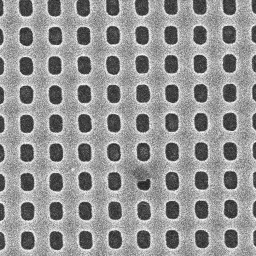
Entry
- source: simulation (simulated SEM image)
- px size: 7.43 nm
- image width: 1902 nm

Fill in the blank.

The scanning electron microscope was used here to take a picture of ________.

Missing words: a regular array of holes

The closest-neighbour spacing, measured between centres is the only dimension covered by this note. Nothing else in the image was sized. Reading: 28.8 px